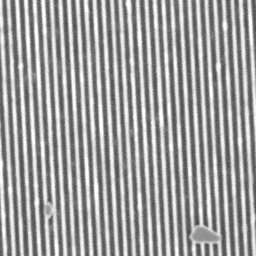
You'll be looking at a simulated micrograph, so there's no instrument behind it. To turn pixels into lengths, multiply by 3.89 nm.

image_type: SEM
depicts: parallel lines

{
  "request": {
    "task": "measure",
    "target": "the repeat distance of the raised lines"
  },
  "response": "0.0334 um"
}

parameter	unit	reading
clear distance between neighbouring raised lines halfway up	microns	0.0233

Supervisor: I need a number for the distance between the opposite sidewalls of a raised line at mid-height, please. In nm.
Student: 10.7